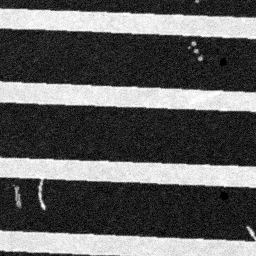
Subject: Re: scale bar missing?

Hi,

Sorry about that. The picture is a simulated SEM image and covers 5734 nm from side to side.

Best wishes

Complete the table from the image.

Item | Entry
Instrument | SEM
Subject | lines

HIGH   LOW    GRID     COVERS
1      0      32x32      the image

00000000000000000000000000000000
11111111110000000000000000000000
11111111111111111111111111111111
00111111111111111111111111111111
00000000000000000000000000111111
00000000000000000000000000000000
00000000000000000000000000000000
00000000000000000000000000000000
00000000000000000000000000000000
00000000000000000000000000000000
11111000000000000000000000000000
11111111111111111111111111110000
11111111111111111111111111111111
00000000000000000000011111111111
00000000000000000000000000000000
00000000000000000000000000000000
00000000000000000000000000000000
00000000000000000000000000000000
00000000000000000000000000000000
00000000000000000000000000000000
11111111111111111111000000000000
11111111111111111111111111111111
00000000000111111111111111111111
00000000000000000000000000000000
00000000000000000000000000000000
00000000000000000000000000000000
00000000000000000000000000000000
00000000000000000000000000000000
00000000000000000000000000000000
11111111111111000000000000000000
11111111111111111111111111111111
00000011111111111111111111111111